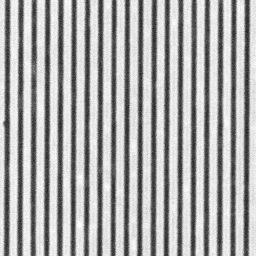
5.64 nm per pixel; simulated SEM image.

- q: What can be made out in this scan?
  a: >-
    parallel lines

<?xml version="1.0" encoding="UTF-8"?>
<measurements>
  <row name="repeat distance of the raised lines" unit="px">13.3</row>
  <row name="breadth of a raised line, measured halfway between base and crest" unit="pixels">7.38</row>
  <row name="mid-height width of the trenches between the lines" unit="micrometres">0.0367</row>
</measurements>